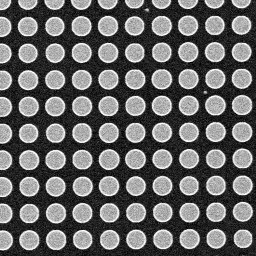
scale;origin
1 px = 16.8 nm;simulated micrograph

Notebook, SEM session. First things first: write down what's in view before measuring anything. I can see an array of small figures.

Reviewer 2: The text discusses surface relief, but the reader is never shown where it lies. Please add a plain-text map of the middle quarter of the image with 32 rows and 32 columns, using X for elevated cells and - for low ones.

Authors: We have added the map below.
--------------------------------
-------------------------------X
---XXX---XXXX---XXXX--XXXX---XXX
--XXXXX--XXXX--XXXXX--XXXXX--XXX
--XXXXX--XXXX--XXXXX--XXXXX--XXX
---XXX---XXXX---XXXX---XXX----XX
--------------------------------
--------------------------------
---XXX----XX----XXX----XXX----XX
--XXXXX--XXXX---XXXX--XXXXX--XXX
--XXXXX--XXXX---XXXX--XXXXX--XXX
--XXXXX--XXXX---XXXX--XXXXX--XXX
---XXX----XXX---XXX----XXX----XX
--------------------------------
--------------------------------
---XXX----XXX---XXXX---XXX----XX
--XXXXX--XXXX---XXXX--XXXXX--XXX
--XXXXX--XXXX---XXXX--XXXXX--XXX
---XXX---XXXX---XXXX---XXXX--XXX
----X-----XX-----XX-----X-------
--------------------------------
----------XX-----XX-----X------X
---XXX---XXXX---XXXX---XXXX--XXX
--XXXXX--XXXXX-XXXXX--XXXXX--XXX
--XXXXX--XXXXX--XXXX--XXXXX--XXX
---XXX---XXXX---XXXX---XXX----XX
--------------------------------
--------------------------------
----XX----XXX----XX----XXX----XX
---XXXX--XXXX---XXXX--XXXXX--XXX
--XXXXX--XXXXX--XXXX--XXXXX--XXX
--XXXXX--XXXXX--XXXX--XXXXX--XXX